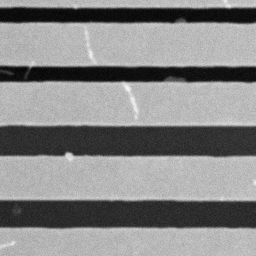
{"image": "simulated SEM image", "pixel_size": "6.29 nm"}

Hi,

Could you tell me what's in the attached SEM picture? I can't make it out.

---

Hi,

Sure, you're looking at lines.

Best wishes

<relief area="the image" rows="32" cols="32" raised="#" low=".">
################################
................................
................................
################################
################################
################################
################################
################################
................................
................................
################################
################################
################################
################################
################################
################################
................................
................................
................................
....##..###.....................
################################
################################
################################
################################
################################
................................
................................
................................
................................
################################
################################
################################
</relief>